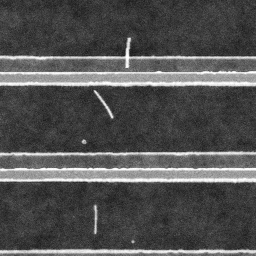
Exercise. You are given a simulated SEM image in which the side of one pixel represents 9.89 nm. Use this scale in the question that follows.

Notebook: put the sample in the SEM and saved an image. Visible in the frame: lines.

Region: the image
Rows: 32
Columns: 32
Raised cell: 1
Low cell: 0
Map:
00000000000000000000000000000000
00000000000000000000000000000000
00000000000000000000000000000000
00000000000000000000000000000000
00000000000000000000000000000000
00000000000000000000000000000000
00000000000000000000000000000000
11111111111111111111111111111111
11111111111111111111111111111111
11111111111111111111111111111111
01110101010000111001100000000100
00000000000000000000000000000000
00000000000000000000000000000000
00000000000000000000000000000000
00000000000000000000000000000000
00000000000000000000000000000000
00000000000000000000000000000000
00000000000000000000000000000000
00000000000000000000000000000000
11111111111111111111111111111111
11111111111111111111111111111111
11111111111111111111111111111111
00000000000000000000000000000000
00000000000000000000000000000000
00000000000000000000000000000000
00000000000000000000000000000000
00000000000000000000000000000000
00000000000000000000000000000000
00000000000000000000000000000000
00000000000000000000000000000000
00000000000000000000000000000000
00001000001111011111111011110111